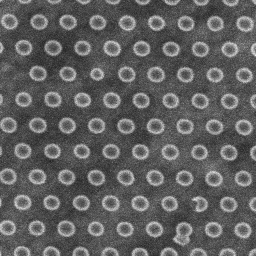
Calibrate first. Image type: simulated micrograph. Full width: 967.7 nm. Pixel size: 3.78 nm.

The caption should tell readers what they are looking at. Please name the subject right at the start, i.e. a regular array of raised bodies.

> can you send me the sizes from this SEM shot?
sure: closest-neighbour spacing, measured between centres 111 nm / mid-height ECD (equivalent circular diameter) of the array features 57.7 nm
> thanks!